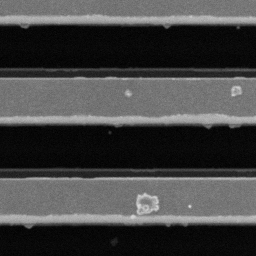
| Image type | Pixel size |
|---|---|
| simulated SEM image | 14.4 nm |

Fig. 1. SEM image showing lines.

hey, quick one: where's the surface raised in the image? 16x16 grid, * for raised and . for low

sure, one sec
****************
.*.*....***...*.
................
................
****************
****************
****************
****************
................
................
................
****************
****************
****************
................
................